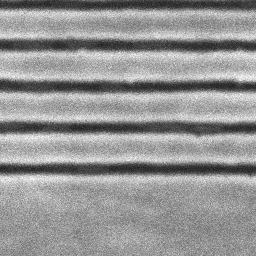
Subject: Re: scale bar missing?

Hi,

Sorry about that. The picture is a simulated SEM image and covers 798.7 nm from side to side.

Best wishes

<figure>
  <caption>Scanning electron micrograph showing parallel lines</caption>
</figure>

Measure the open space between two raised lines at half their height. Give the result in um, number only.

0.0374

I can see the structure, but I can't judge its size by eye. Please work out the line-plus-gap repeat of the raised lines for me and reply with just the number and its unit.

128 nanometres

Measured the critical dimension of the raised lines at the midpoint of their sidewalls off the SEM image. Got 91.6 nanometers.